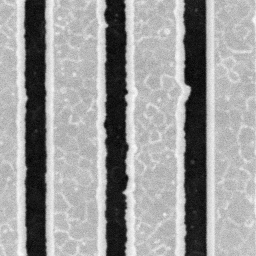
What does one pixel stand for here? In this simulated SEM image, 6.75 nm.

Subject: one or a few lines or trenches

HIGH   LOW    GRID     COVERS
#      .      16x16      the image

#..###..###..###
#..###..###..###
#..###..###..###
#..###..###..###
#..###..###..###
#..###..###..###
#..###..###..###
#..###..###..###
#..###..###..###
#..###..###..###
#..###..###..###
#..###..###..###
#..###..###..###
#..###..###..###
#..###..###..###
#..###..###..###